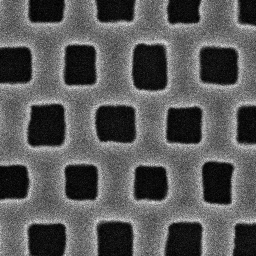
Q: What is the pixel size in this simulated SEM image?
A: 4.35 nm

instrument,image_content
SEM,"a regular array of holes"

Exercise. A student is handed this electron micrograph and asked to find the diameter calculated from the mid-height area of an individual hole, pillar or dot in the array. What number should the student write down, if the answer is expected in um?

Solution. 0.172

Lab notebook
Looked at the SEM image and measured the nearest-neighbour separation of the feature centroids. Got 0.289 microns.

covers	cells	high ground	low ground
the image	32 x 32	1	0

11100000111100000111100001111100
11100000111100000111100001111100
11110000111100001111100001111100
11111111111111111111111111111111
11111111111111111111111111111111
11111111111111111011111111111111
00001111000011111000011110000011
00001111000011111000011110000011
00001111000011111000011110000011
00001111000011111000011110000011
11111111000011111000011111000111
11111111111111111111111111111111
11111111111111111111111111111111
11110000111100000111100001111100
11110000111100000111100001111100
11110000111100000111100001111100
11100000111100000111100001111100
11100000111100000111100001111100
11111111111111111111111111111111
11111111111111111111111111111111
11111111111111111111111111000111
00011111000011111000011110000111
00001111000011111000011110000111
00001111000011111000011110000111
00011111000011111000011110000111
11111111111111111111111111101111
11111111111111111111111111111111
11111111111111111111111111111111
11110000111100001111100001111000
11100000111100000111100001111000
11100000111100000111100001111000
11110000111100000111100001111000